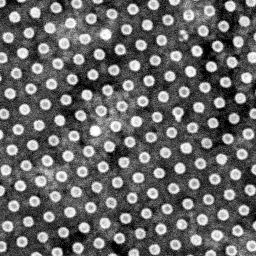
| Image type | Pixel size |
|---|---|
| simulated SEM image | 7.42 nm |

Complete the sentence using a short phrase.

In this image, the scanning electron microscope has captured a regular array of raised bodies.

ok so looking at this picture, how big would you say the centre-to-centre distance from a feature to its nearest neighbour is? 156 nm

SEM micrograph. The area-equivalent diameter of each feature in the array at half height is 67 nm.